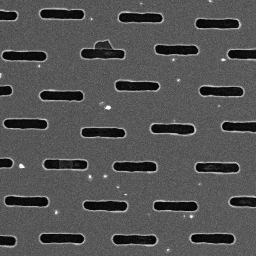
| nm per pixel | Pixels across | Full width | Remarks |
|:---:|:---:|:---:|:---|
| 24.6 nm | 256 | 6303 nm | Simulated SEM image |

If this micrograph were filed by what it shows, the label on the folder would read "a regular array of holes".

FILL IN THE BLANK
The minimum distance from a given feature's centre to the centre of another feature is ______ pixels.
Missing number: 48.7